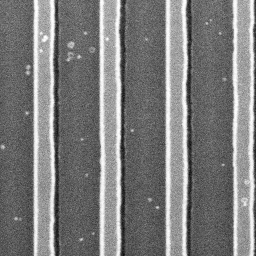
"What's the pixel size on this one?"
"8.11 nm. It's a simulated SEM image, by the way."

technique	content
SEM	lines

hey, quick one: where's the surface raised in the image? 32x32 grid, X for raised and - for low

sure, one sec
----XXX------XX------XX------XXX
----XXX------XX------XX------XXX
----XXX------XX------XX------XXX
----XXX------XX------XX------XXX
----XXX------XX------XX------XXX
----XXX------XX------XX------XXX
----XXX------XX------XX------XXX
----XXX------XX------XX------XXX
----XXX------XX------XX------XXX
----XXX------XX------XX------XXX
----XXX------XX------XX------XXX
----XXX------XX------XX------XXX
----XXX------XX------XX------XXX
----XXX------XX------XX------XXX
----XXX------XX------XX------XXX
----XXX------XX------XX------XXX
----XXX------XX------XX------XXX
----XXX------XX------XX------XXX
----XXX------XX------XX------XXX
----XXX------XX------XX------XXX
----XXX------XX------XX------XXX
----XXX------XX------XX------XXX
----XXX------XX------XX------XXX
----XXX------XX------XX------XXX
----XXX------XX------XX------XXX
----XXX------XX------XX------XXX
----XXX------XX------XX------XXX
----XXX------XX------XX------XXX
----XXX------XX------XX------XXX
----XXX------XX------XX------XXX
----XXX------XX------XX------XXX
----XXX------XX------XX------XXX